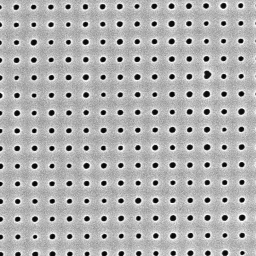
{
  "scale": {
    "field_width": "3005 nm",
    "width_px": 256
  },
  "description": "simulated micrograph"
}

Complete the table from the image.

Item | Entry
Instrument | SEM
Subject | a regular array of holes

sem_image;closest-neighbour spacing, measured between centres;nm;200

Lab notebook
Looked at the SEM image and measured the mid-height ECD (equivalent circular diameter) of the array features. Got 67.6 nm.